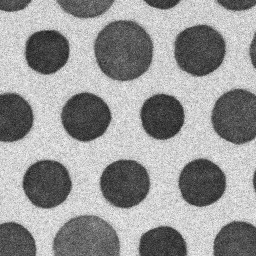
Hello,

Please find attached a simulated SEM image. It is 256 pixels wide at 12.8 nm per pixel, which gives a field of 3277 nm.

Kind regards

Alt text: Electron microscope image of a regular array of holes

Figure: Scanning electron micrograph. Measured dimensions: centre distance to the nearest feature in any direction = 976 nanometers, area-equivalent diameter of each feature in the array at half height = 622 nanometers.